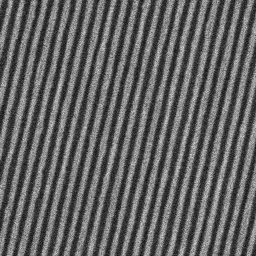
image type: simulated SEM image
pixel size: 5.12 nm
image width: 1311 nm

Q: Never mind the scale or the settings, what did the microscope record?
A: parallel lines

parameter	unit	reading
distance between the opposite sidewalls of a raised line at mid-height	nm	26.8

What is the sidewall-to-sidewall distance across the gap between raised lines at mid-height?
31.8 nm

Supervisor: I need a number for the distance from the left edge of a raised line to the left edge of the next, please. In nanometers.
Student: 56.9